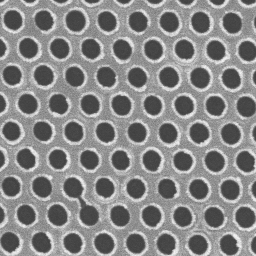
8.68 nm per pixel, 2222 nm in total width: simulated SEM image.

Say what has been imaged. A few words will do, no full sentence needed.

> a regular array of holes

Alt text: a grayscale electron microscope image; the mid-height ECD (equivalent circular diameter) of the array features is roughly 161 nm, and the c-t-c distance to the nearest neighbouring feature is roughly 270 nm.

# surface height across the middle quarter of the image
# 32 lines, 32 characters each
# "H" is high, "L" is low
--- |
HHHHHHHHHHHHHHHHHHHHHHHHHHHHHHHH
HLLLHHHHHLLLHHHHHLLLHHHHHLLHHHHH
LLLLLHHHLLLLLHHHLLLLHHHHLLLLHHHH
LLLLLHHHLLLLLHHHLLLLLHHHLLLLLHHH
HLLLLHHHHLLLLHHHLLLLLHHHLLLLHHHH
HHLHHHHHHHLLHHHHHHLLHHHHHLLLHHHH
HHHHHHHHHHHHHHHHHHHHHHHHHHHHHHHH
HHHHHHHHHHHHHHHHHHHHHHHHHHHHHHHH
HHHHHLLLHHHHHLLLHHHHHLLHHHHHLLLH
LHHHLLLLLHHHLLLLHHHHLLLLHHHHLLLL
LHHHLLLLLHHHLLLLLHHHLLLLHHHHLLLL
LHHHHLLLLHHHLLLLHHHHLLLLHHHHLLLL
HHHHHHHHHHHHHLLLHHHHHHLHHHHHHLLH
HHHHHHHHHHHHHHHHHHHHHHHHHHHHHHHH
HHHHHHHHHHHHHHHHHHHHHHHHHHHHHHHH
HLLLHHHHLLLLHHHHHLLLHHHHLLLHHHHH
LLLLLHHHLLLLHHHHLLLLHHHHLLLLHHHH
LLLLLHHHLLLLLHHHLLLLLHHHLLLLHHHH
HLLLHHHHHLLLHHHHLLLLHHHHLLLLHHHH
HHHHHHHHHHLHHHHHHHLHHHHHHLLHHHHH
HHHHHHHHHHHHHHHHHHHHHHHHHHHHHHHH
HHHHHHHHHHHHHHHHHHHHHHHHHHHHHHHH
HHHHLLLLHHHHLLLLHHHHLLLHHHHHLLLH
LHHHLLLLHHHHLLLLHHHHLLLLHHHLLLLL
LHHHLLLLLHHHLLLLHHHHLLLLHHHLLLLL
HHHHHLLLHHHHHLLLHHHHLLLLHHHHLLLL
HHHHHHHHHHHHHHHHHHHHHLLHHHHHHLLH
HHHHHHHHHHHHHHHHHHHHHHHHHHHHHHHH
HLHHHHHHHHHHHHHHHHHHHHHHHHHHHHHH
LLLLHHHHLLLLHHHHLLLHHHHHLLLHHHHH
LLLLLHHHLLLLHHHHLLLLHHHHLLLLHHHH
LLLLLHHHLLLLHHHHLLLLHHHHLLLLHHHL